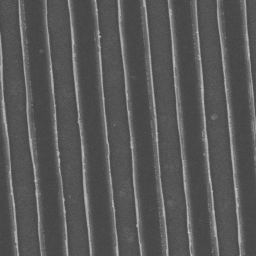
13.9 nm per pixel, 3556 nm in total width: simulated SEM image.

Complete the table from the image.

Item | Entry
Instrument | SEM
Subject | parallel lines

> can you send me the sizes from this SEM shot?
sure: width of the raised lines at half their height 0.381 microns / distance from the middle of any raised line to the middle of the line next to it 690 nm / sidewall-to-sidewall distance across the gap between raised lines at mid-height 22.4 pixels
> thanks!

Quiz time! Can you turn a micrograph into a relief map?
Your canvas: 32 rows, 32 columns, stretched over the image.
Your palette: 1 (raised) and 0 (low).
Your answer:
00111100011100011100011110011110
00111100011100011100011110011110
00111100011100011100011110011110
00011100011100011100011110011110
00011100011100011110011110001110
00011100011110011110001110001110
00011100011110011110001110001110
00011100011110011110001110001110
00011100011110001110001110001110
00011110011110001110001110001110
00011110011110001110001110001111
00011110011110001110001110001111
00011110001110001110001110001111
10011110001110001110001110001111
10011110001110001111001111000111
10001110001110001111001111000111
10001110001110001111001111000111
10001110001110001111000111000111
10001110001111001111000111000111
10001110001111000111000111000111
10001110001111000111000111000111
10001111001111000111000111000111
10001111001111000111000111000111
11001111000111000111000111000111
11000111000111000111000111100011
11000111000111000111000111100011
11000111000111000111100111100011
11000111000111000111100111100011
11000111000111000111100111100011
11000111000111100111100011100011
11000111000111100111100011100011
11000111000111100011100011100011